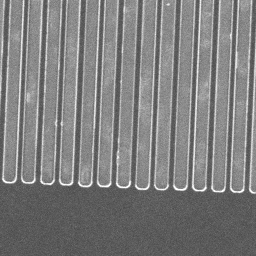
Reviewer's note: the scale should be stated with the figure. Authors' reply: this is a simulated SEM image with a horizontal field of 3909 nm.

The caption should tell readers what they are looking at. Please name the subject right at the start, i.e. parallel lines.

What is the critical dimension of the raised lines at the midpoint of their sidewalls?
107 nm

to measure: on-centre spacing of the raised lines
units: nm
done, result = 290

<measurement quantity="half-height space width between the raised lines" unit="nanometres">189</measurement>